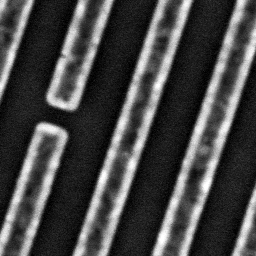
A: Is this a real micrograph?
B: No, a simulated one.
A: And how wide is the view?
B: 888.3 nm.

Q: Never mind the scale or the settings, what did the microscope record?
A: one or a few lines or trenches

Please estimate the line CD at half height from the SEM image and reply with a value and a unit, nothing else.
89.2 nanometers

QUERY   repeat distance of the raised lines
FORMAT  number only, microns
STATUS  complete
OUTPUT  0.261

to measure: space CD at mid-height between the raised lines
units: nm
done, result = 176